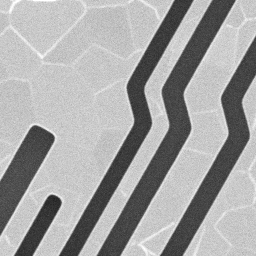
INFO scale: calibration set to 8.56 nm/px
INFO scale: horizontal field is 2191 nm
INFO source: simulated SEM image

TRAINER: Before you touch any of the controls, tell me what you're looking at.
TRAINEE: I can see groups of lines, slits or small figures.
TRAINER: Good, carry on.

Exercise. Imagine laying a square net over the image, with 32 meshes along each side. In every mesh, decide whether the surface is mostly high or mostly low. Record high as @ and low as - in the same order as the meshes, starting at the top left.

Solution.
@@@@@@@@@@@@@@@@@@@@@---@@---@@@
@@@@@@@@@@@@@@@@@@@@@--@@@---@@@
@@@@@@@@@@@@@@@@@@@@---@@---@@@@
@@@@@@@@@@@@@@@@@@@@--@@----@@@@
@@@@@@@@@@@@@@@@@@@---@@---@@@@@
@@@@@@@@@@@@@@@@@@@--@@---@@@@@-
@@@@@@@@@@@@@@@@@@---@@---@@@@@-
@@@@@@@@@@@@@@@@@@--@@---@@@@@--
@@@@@@@@@@@@@@@@@--@@@---@@@@@--
@@@@@@@@@@@@@@@@---@@---@@@@@---
@@@@@@@@@@@@@@@@--@@----@@@@---@
@@@@@@@@@@@@@@@@--@@---@@@@@---@
@@@@@@@@@@@@@@@@--@@---@@@@@--@@
@@@@@@@@@@@@@@@@---@@--@@@@@--@@
@@@@@@@@@@@@@@@@@--@@---@@@@---@
@@@@@@@@@@@@@@@@@--@@---@@@@---@
@@@---@@@@@@@@@@---@@---@@@@---@
@@@----@@@@@@@@@--@@---@@@@@---@
@@----@@@@@@@@@---@@---@@@@@---@
@@----@@@@@@@@---@@---@@@@@---@@
@----@@@@@@@@@--@@@---@@@@---@@@
@----@@@@@@@@---@@---@@@@@---@@@
----@@@@@@@@@--@@---@@@@@---@@@@
----@@@@@@@@---@@---@@@@@---@@@@
---@@@-@@@@@--@@---@@@@@---@@@@@
--@@@---@@@---@@---@@@@@---@@@@@
--@@@--@@@---@@---@@@@@---@@@@@@
-@@@---@@@--@@@---@@@@@--@@@@@@@
-@@@--@@@---@@---@@@@@---@@@@@@@
@@@---@@@--@@----@@@@---@@@@@@@@
@@@--@@@---@@---@@@@@---@@@@@@@@
@@--@@@@--@@---@@@@@---@@@@@@@@@